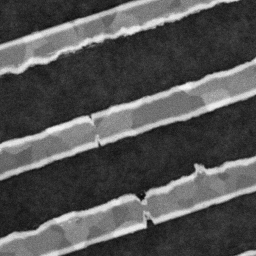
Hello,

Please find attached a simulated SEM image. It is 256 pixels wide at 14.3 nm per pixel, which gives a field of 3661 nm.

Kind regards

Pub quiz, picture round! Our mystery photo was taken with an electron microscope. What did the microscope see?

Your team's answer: one or a few lines or trenches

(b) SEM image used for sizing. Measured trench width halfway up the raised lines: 915 nm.